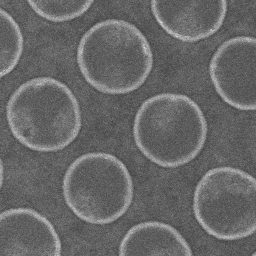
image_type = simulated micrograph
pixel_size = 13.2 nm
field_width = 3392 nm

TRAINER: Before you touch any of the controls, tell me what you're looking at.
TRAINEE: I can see raised bodies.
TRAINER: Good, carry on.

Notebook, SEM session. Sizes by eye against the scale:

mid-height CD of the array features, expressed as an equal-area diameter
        70.3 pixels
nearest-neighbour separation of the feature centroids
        1210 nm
